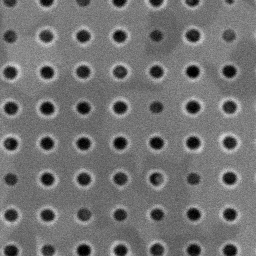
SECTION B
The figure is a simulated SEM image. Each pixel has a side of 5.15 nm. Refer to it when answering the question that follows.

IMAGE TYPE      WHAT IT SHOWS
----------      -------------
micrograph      a regular array of holes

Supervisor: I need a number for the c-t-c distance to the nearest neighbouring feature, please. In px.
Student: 35.6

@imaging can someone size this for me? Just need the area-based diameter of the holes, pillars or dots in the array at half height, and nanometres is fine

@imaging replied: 73.2